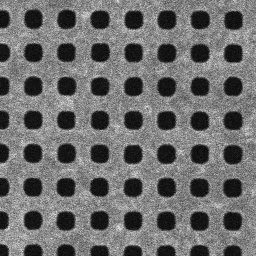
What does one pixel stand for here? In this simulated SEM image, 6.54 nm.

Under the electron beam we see a regular array of holes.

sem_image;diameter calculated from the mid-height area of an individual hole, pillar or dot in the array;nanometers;132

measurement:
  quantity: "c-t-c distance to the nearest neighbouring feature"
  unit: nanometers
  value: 216